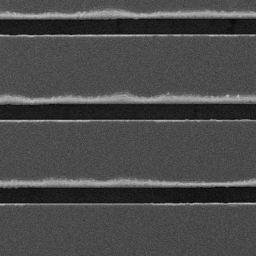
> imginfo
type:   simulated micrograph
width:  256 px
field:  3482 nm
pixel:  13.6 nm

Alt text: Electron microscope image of lines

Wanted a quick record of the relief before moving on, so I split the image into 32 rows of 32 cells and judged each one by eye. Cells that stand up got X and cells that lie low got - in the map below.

XXXXXXXXXXXXXXXXXXXXXXXXXXXXXXXX
XXXXXXXXXXXXXXXXXXXXXXXXXXXXXXXX
--------------------------------
--------------------------------
XXXXXXXXXXXXXXXXXXXXXXXXXXXXXXXX
XXXXXXXXXXXXXXXXXXXXXXXXXXXXXXXX
XXXXXXXXXXXXXXXXXXXXXXXXXXXXXXXX
XXXXXXXXXXXXXXXXXXXXXXXXXXXXXXXX
XXXXXXXXXXXXXXXXXXXXXXXXXXXXXXXX
XXXXXXXXXXXXXXXXXXXXXXXXXXXXXXXX
XXXXXXXXXXXXXXXXXXXXXXXXXXXXXXXX
XXXXXXXXXXXXXXXXXXXXXXXXXXXXXXXX
XXXXXXXXXXXXXXXXXXXXXXXXXXXXXXXX
--------------------------------
--------------------------------
XXXXXXXXXXXXXXXXXXXXXXXXXXXXXXXX
XXXXXXXXXXXXXXXXXXXXXXXXXXXXXXXX
XXXXXXXXXXXXXXXXXXXXXXXXXXXXXXXX
XXXXXXXXXXXXXXXXXXXXXXXXXXXXXXXX
XXXXXXXXXXXXXXXXXXXXXXXXXXXXXXXX
XXXXXXXXXXXXXXXXXXXXXXXXXXXXXXXX
XXXXXXXXXXXXXXXXXXXXXXXXXXXXXXXX
XXXXXXXXXXXXXXXXXXXXXXXXXXXXXXXX
--------------------------------
--------------------------------
------------------X-XXXXXXXXXXXX
XXXXXXXXXXXXXXXXXXXXXXXXXXXXXXXX
XXXXXXXXXXXXXXXXXXXXXXXXXXXXXXXX
XXXXXXXXXXXXXXXXXXXXXXXXXXXXXXXX
XXXXXXXXXXXXXXXXXXXXXXXXXXXXXXXX
XXXXXXXXXXXXXXXXXXXXXXXXXXXXXXXX
XXXXXXXXXXXXXXXXXXXXXXXXXXXXXXXX